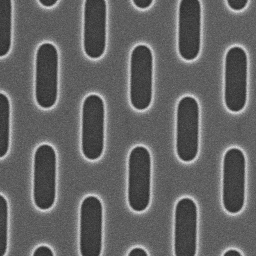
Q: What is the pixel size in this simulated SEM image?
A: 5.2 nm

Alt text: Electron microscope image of groups of lines, slits or small figures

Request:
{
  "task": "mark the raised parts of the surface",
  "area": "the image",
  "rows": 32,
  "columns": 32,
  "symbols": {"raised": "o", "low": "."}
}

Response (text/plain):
..ooo..oooo..oooo..ooo...oooo..o
..oooooooo...ooooooooo...ooooooo
..oooooooo...ooooooooo...ooooooo
..oooooooo...ooooooooo...ooooooo
..oooooooo...ooooooooo...ooooooo
.oooo.oooo...ooooooooo...ooooooo
.oooo..oooo..ooo...ooo...ooo...o
oooo...ooooooooo...oooo.oooo...o
oooo...ooooooooo...ooooooooo...o
oooo...ooooooooo...ooooooooo...o
oooo...ooooooooo...ooooooooo...o
oooo...ooooooooo...ooooooooo...o
.oooo..oooo..ooo...oooo.oooo...o
.ooooooooo...oooo.oooo...ooo..oo
.ooooooooo...ooooooooo...ooooooo
.ooooooooo...ooooooooo...ooooooo
.ooooooooo...ooooooooo...ooooooo
.ooooooooo...ooooooooo...ooooooo
.oooo..ooo...oooo.oooo...ooooooo
oooo...oooo..ooo...ooo...ooo...o
oooo...ooooooooo...ooooooooo...o
oooo...ooooooooo...ooooooooo...o
oooo...ooooooooo...ooooooooo...o
oooo...ooooooooo...ooooooooo...o
oooo...ooooooooo...ooooooooo...o
.ooo...ooo...ooo...ooo..oooo..oo
.ooooooooo...ooooooooo...oooo.oo
.ooooooooo...ooooooooo...ooooooo
.ooooooooo...ooooooooo...ooooooo
.ooooooooo...ooooooooo...ooooooo
.ooooooooo...ooooooooo...ooooooo
.ooo...ooo...ooo..oooo...ooo..oo